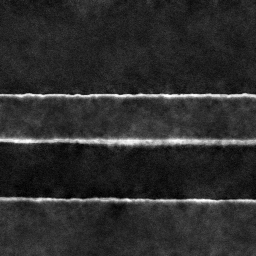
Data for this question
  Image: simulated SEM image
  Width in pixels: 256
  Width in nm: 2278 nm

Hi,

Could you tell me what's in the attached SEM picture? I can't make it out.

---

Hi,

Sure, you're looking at lines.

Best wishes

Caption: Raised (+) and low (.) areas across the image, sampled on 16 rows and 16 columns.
................
................
................
................
................
................
++++++++++++++++
++++++++++++++++
++++++++++++++++
................
................
................
+.++............
++++++++++++++++
++++++++++++++++
++++++++++++++++